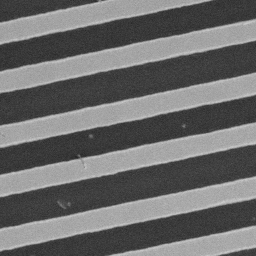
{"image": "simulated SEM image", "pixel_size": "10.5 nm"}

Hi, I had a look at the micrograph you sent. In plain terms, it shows lines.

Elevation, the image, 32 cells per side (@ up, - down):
-----------@@@@@@@@@@@@@--------
------@@@@@@@@@@@@@@------------
--@@@@@@@@@@@@------------------
@@@@@@@@@@----------------@@@@@@
@@@@@-----------------@@@@@@@@@@
-----------------@@@@@@@@@@@@@--
------------@@@@@@@@@@@@@-------
-------@@@@@@@@@@@@@------------
--@@@@@@@@@@@@@-----------------
@@@@@@@@@@--------------------@@
@@@@@@-------------------@@@@@@@
@--------------------@@@@@@@@@@@
----------------@@@@@@@@@@@@@---
-----------@@@@@@@@@@@@@--------
------@@@@@@@@@@@@@-------------
-@@@@@@@@@@@@@-----------------@
@@@@@@@@@-----------------@@@@@@
@@@@@----------------@@@@@@@@@@@
-----------------@@@@@@@@@@@@---
------------@@@@@@@@@@@@@-------
------@@@@@@@@@@@@@@------------
--@@@@@@@@@@@@@-----------------
@@@@@@@@@@--------------------@@
@@@@@--------------------@@@@@@@
@-------------------@@@@@@@@@@@@
---------------@@@@@@@@@@@@@----
-----------@@@@@@@@@@@@@--------
------@@@@@@@@@@@@@-------------
@@@@@@@@@@@@@@----------------@@
@@@@@@@@@-----------------@@@@@@
@@@@@----------------@@@@@@@@@@@
----------------@@@@@@@@@@@@@---